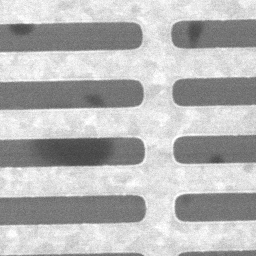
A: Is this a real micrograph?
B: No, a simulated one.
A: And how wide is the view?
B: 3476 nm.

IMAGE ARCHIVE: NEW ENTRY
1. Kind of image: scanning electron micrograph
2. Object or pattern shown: groups of lines, slits or small figures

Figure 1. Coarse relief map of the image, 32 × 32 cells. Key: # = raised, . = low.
################################
################################
#######################.........
..................###...........
..................###...........
..................####..........
...........#####################
################################
################################
################################
..................####..........
..................###...........
..................####..........
................################
################################
################################
################################
..................####..........
..................####..........
..................####..........
..................####..........
################################
################################
################################
..................####..........
..................####..........
..................####..........
..................####..........
################################
################################
################################
#######################.........